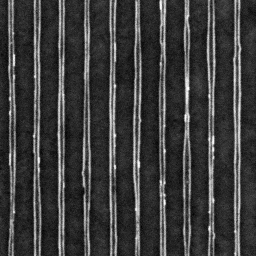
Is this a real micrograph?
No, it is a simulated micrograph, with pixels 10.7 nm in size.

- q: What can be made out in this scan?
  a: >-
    parallel lines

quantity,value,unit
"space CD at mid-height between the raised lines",20.4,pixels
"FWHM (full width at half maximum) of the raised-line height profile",46.8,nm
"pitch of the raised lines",268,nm